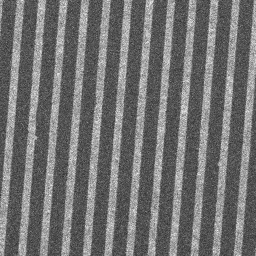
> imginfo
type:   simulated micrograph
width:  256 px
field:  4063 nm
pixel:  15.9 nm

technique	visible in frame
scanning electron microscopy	parallel lines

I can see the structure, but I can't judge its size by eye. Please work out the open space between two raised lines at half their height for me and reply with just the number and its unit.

14.6 px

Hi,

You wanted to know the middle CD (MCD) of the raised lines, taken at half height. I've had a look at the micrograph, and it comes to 6.98 px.